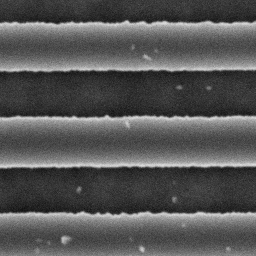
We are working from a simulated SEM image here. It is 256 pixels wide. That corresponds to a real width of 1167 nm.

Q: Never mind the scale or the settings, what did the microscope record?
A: lines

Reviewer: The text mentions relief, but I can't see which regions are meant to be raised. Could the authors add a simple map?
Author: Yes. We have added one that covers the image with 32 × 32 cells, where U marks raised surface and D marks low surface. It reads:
DDDDDDDDDDDDDDDDDDDDDDDDDDDDDDDD
DDDDDDDDDDDDDDDDDDDDDDDDDDDDDDDD
DDDDDDDDDDDDDDDDDDDDDDDDDDDDDDDD
UUUUUUUUUUUUUUUUUUUUUUUUUUUUUUUU
UUUUUUUUUUUUUUUUUUUUUUUUUUUUUUUU
UUUUUUUUUUUUUUUUUUUUUUUUUUUUUUUU
UUUUUUUUUUUUUUUUUUUUUUUUUUUUUUUU
UUUUUUUUUUUUUUUUUUUUUUUUUUUUUUUU
UUUUUUUUUUUUUUUUUUUUUUUUUUUUUUUU
DDDDDDDDDDDDDDDDDDDDDDDDDDDDDDDD
DDDDDDDDDDDDDDDDDDDDDDDDDDDDDDDD
DDDDDDDDDDDDDDDDDDDDDDDDDDDDDDDD
DDDDDDDDDDDDDDDDDDDDDDDDDDDDDDDD
DDDDDDDDDDDDDDDDDDDDDDDDDDDDDDDD
DDDDDDDDDDDDDDDDDDDDDDDDDDDDDDDD
UUUUUUUUUUUUUUUUUUUUUUUUUUUUUUUU
UUUUUUUUUUUUUUUUUUUUUUUUUUUUUUUU
UUUUUUUUUUUUUUUUUUUUUUUUUUUUUUUU
UUUUUUUUUUUUUUUUUUUUUUUUUUUUUUUU
UUUUUUUUUUUUUUUUUUUUUUUUUUUUUUUU
UUUUUUUUUUUUUUUUUUUUUUUUUUUUUUUU
DDDDDDDDDDDDDDDDDDDDDDDDDDDDDDDD
DDDDDDDDDDDDDDDDDDDDDDDDDDDDDDDD
DDDDDDDDDDDDDDDDDDDDDDDDDDDDDDDD
DDDDDDDDDDDDDDDDDDDDDDDDDDDDDDDD
DDDDDDDDDDDDDDDDDDDDDDDDDDDDDDDD
DDDDDDDDDDDDDDDDDDDDDDDDDDDDDDDD
UUUUUUUUUUUUUUUUUUUUUUUUUUUUUUUU
UUUUUUUUUUUUUUUUUUUUUUUUUUUUUUUU
UUUUUUUUUUUUUUUUUUUUUUUUUUUUUUUU
UUUUUUUUUUUUUUUUUUUUUUUUUUUUUUUU
UUUUUUUUUUUUUUUUUUUUUUUUUUUUUUUU